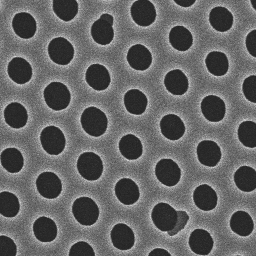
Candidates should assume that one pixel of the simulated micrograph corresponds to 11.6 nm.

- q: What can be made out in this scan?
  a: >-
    a regular array of holes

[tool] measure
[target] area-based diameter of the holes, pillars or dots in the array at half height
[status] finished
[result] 297 nm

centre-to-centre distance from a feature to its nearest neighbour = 515 nm